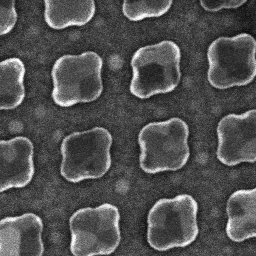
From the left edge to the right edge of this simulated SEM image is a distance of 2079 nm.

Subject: raised bodies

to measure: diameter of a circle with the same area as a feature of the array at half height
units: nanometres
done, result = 428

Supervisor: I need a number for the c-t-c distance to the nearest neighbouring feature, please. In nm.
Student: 625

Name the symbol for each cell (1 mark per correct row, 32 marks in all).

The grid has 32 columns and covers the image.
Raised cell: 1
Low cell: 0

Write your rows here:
11000011111100001111100001111100
11000011111100001111100000000000
11000011111000000000000000000000
11000001000000000000000000000000
00000000000000000000000000000010
00000000000000000000110000111111
00000000000000000111110000111111
01000001111110000111110000111111
11100001111110000111110000111111
11100001111110000111110000111111
11100001111110000111110000011100
11100001111110000111100000000000
11100001111100000000000000000000
10000000000000000000000000000000
00000000000000000000000000001111
00000000000000000001111000011111
00000000001110000011111000011111
01100000111111000111111000011111
11110000111111000011111000011111
11110000111111000011111100011111
11110000111111000011111000000000
11110000111110000000000000000000
11110000010000000000000000000000
10000000000000000000000000000000
00000000000000000000000000000111
00000000000000000000111100001111
00000000001111100001111100001111
11111000011111100001111100000111
11111000011111100001111110001111
11111000011111100001111100000111
11111000011111100001111000000000
11111000011111000000000000000000